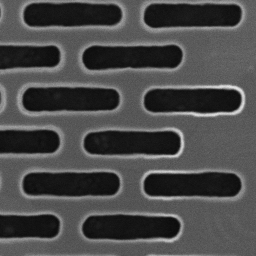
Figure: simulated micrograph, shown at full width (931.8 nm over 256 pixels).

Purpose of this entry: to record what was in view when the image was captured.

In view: a regular array of holes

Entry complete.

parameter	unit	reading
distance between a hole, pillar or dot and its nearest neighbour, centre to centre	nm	268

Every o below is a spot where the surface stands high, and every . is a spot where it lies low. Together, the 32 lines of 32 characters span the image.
oooo..........ooooo..........ooo
ooo............ooo............oo
ooo............ooo............oo
ooooooooooooooooooooo.oooooooooo
oooooooooooooooooooooooooooooooo
oooooooooooooooooooooooooooooooo
........ooo............ooooooooo
........oo.............ooooooooo
...oooooooo....oo.....oooooooooo
oooooooooooooooooooooooooooooooo
oooooooooooooooooooooooooooooooo
ooo............ooo............oo
ooo............ooo............oo
ooo...........oooo............oo
oooooooooooooooooooooooooooooooo
oooooooooooooooooooooooooooooooo
.......ooooo..........oooooooooo
.......ooo.............ooooooooo
.......oooo............ooooooooo
ooooooooooooooo.oooooooooooooooo
oooooooooooooooooooooooooooooooo
ooooooo..ooo.ooooooooooooo.ooooo
ooo............ooo............oo
ooo............ooo............oo
ooooo......o.oooooo..........ooo
oooooooooooooooooooooooooooooooo
oooooooooooooooooooooooooooooooo
.......oooo...........oooooooooo
.......ooo.............ooooooooo
.......oooo...........oooooooooo
oooooooooooooooooooooooooooooooo
oooooooooooooooooooooooooooooooo